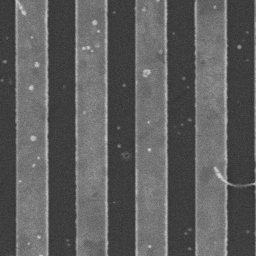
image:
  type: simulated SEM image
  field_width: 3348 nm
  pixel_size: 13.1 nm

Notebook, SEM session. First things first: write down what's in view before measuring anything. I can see lines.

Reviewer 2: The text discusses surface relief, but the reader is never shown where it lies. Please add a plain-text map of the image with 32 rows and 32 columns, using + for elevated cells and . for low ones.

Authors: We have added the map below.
..++++....+++....++++...++++....
..++++....+++....++++...++++....
..++++....+++....++++...++++....
..++++....+++....++++...++++....
..++++....+++....++++...++++....
..++++....+++....++++...++++....
..++++....+++....++++...++++....
..++++....+++....++++...++++....
..++++....+++....++++....+++....
..++++....+++....++++....+++....
..++++....+++....++++....+++....
..++++....+++....++++....+++....
..++++....+++....++++....+++....
..++++....+++....++++....+++....
..++++....+++....++++....+++....
..++++....+++....++++....+++....
..++++....+++....++++....+++....
..++++....+++....++++....+++....
..++++....+++....++++....+++....
..++++....+++....++++....+++....
..++++....+++....++++....+++....
..++++....+++....++++....+++....
..++++....+++....++++....+++....
..++++....+++....++++....+++....
..++++....+++....++++....+++....
..++++....+++....++++....+++....
..++++....+++....++++....+++....
..++++....+++....++++....+++....
..++++....+++....++++....+++....
..++++....+++....++++....+++....
..++++....+++....++++....+++....
..++++....+++....++++....+++....